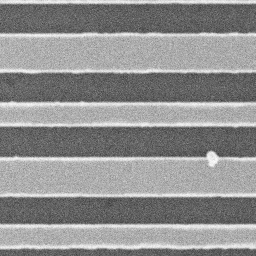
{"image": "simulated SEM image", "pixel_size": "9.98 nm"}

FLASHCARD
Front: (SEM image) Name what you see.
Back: lines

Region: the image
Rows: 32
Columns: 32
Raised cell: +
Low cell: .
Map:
................................
................................
................................
................................
++++++++++++++++++++++++++++++++
++++++++++++++++++++++++++++++++
++++++++++++++++++++++++++++++++
++++++++++++++++++++++++++++++++
++++++++++++++++++++++++++++++++
................................
................................
................................
................................
++++++++++++++++++++++++++++++++
++++++++++++++++++++++++++++++++
++++++++++++++++++++++++++++++++
................................
................................
................................
..........................+.....
++++++++++++++++++++++++++++++++
++++++++++++++++++++++++++++++++
++++++++++++++++++++++++++++++++
++++++++++++++++++++++++++++++++
...+++.....+++++............+...
................................
................................
................................
++++++++++++++++++++++++++++++++
++++++++++++++++++++++++++++++++
++++++++++++++++++++++++++++++++
................................